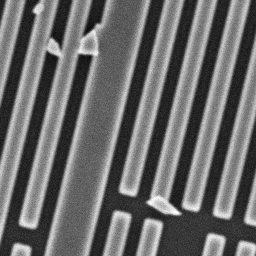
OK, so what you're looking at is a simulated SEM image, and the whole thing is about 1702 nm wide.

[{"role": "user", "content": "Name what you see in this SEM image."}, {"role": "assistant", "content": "groups of lines, slits or small figures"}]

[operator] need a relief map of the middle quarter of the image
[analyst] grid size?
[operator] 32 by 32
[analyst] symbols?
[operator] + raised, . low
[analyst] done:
+++....++++++++++....+++++....++
+++....++++++++++....++++.....++
++....+++++++++++....++++....+++
++....+++++++++++....++++....+++
++....+++++++++++...+++++....+++
++....++++++++++....++++.....+++
+....+++++++++++....++++....++++
+....+++++++++++....++++....++++
+....+++++++++++...+++++....++++
+....++++++++++....+++++....++++
....+++++++++++....++++....+++++
....+++++++++++....++++....++++.
....+++++++++++...+++++....++++.
....++++++++++....+++++....++++.
...+++++++++++....++++....+++++.
...+++++++++++....++++....+++++.
...+++++++++++...+++++....++++..
...++++++++++....+++++....++++..
...++++++++++....++++....+++++..
..+++++++++++....++++....+++++..
..+++++++++++....++++....++++...
..++++++++++....+++++....++++...
..++++++++++....++++....+++++...
.+++++++++++....++++....+++++...
.+++++++++++....++++....++++....
.++++++++++....+++++....++++....
.++++++++++....++++.....++++....
+++++++++++....++++....+++++...+
+++++++++++....++++....++++....+
++++++++++....+++++....++++....+
++++++++++....++++.....++++....+
++++++++++....++++....+++++....+